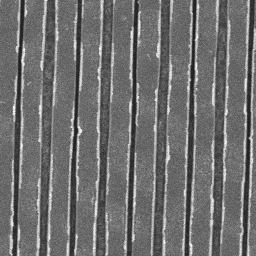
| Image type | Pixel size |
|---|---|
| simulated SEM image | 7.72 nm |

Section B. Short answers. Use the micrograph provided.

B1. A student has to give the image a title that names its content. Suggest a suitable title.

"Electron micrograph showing parallel lines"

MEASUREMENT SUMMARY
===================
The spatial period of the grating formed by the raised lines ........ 225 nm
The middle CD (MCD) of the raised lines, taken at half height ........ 169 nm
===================